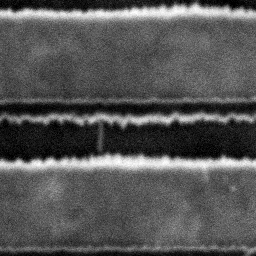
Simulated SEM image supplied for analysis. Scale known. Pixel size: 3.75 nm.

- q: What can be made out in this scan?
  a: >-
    lines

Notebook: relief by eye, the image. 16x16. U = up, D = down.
DDDDDDDDDDDDDDDD
UUUUUUUUUUUUUUUU
UUUUUUUUUUUUUUUU
UUUUUUUUUUUUUUUU
UUUUUUUUUUUUUUUU
UUUUUUUUUUUUUUUU
UUUUUUUUUUUUUUUU
DDUDDUDUUDDDDDDD
DDDDDDDDDDDDDDDD
DDDDDDDDDDDDDDDD
UUUUUUUUUUUUUUUU
UUUUUUUUUUUUUUUU
UUUUUUUUUUUUUUUU
UUUUUUUUUUUUUUUU
UUUUUUUUUUUUUUUU
UUUUUUUUUUUUUUUU